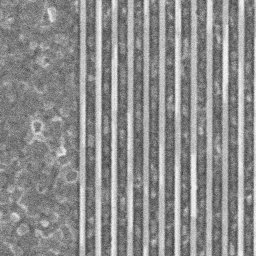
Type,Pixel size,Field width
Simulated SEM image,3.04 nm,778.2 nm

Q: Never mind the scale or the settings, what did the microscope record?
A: parallel lines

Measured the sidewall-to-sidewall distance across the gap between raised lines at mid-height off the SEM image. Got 0.033 micrometres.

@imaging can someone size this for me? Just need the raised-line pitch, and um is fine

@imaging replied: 0.0481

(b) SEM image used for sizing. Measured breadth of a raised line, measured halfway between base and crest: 13.7 nm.